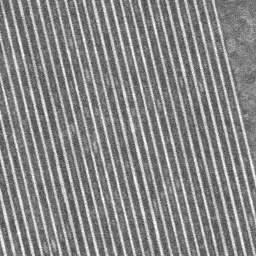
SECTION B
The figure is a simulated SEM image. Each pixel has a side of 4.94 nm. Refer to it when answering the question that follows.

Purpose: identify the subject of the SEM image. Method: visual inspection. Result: parallel lines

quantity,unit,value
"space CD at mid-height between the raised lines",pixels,6.68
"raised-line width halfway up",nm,8.5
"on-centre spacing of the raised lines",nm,44.3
